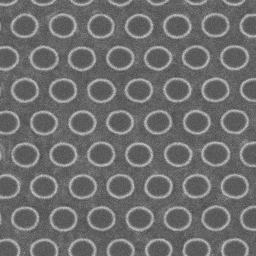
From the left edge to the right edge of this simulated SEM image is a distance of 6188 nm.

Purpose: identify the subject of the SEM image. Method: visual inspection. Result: a regular array of raised bodies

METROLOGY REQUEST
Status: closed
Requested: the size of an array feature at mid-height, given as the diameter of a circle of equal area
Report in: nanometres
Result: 599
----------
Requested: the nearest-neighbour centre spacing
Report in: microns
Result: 0.893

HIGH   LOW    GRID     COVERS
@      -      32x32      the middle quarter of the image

--@@@@@-----@@@@-----@@@@@-----@
----@---------------------------
--------------------------------
--------------------------------
@@-----@@@@@-----@@@@-----@@@@@-
@@@---@@@@@@----@@@@@@---@@@@@@-
@@@---@@@@@@@---@@@@@@---@@@@@@-
@@@---@@@@@@@---@@@@@@---@@@@@@-
@@-----@@@@@----@@@@@-----@@@@@-
--------@@----------------------
--------------------------------
--------------------------------
---@@@@-----@@@@------@@@@-----@
--@@@@@@---@@@@@@----@@@@@@---@@
-@@@@@@@---@@@@@@---@@@@@@@---@@
--@@@@@@---@@@@@@---@@@@@@----@@
--@@@@@-----@@@@-----@@@@@-----@
--------------------------------
--------------------------------
--------------------------------
@@-----@@@@@-----@@@@-----@@@@@-
@@@---@@@@@@----@@@@@@---@@@@@@@
@@@---@@@@@@@---@@@@@@---@@@@@@@
@@@---@@@@@@----@@@@@@----@@@@@@
@@-----@@@@@----@@@@@-----@@@@@-
--------------------------------
--------------------------------
--------------------------------
--@@@@@-----@@@@@----@@@@@-----@
--@@@@@@---@@@@@@----@@@@@@---@@
-@@@@@@@---@@@@@@---@@@@@@@---@@
--@@@@@@---@@@@@@----@@@@@@---@@